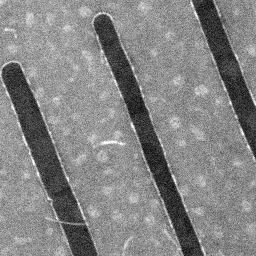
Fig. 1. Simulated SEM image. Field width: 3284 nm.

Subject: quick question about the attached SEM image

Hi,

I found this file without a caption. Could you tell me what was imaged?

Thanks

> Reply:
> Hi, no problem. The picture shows one or a few lines or trenches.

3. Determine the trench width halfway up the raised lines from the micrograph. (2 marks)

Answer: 1010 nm